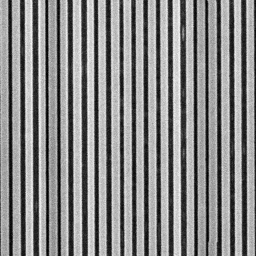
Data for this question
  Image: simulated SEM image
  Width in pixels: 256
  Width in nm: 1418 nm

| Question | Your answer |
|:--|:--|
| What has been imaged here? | parallel lines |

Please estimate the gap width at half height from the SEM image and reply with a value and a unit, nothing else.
30.5 nanometres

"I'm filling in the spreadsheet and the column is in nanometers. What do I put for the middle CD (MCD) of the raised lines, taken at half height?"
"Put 40.9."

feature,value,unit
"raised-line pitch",68.2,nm